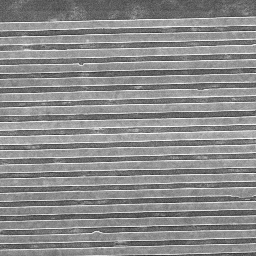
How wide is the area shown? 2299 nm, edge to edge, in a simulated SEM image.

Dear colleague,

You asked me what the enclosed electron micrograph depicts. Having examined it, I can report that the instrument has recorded parallel lines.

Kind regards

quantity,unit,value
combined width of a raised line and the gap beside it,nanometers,127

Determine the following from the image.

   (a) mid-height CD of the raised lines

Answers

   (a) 70.7 nm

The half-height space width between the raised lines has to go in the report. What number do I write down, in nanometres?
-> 55